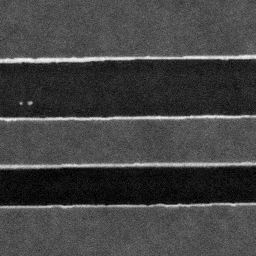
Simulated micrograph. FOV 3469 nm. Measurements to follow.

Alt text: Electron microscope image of lines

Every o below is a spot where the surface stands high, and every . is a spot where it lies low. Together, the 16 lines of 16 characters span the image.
oooooooooooooooo
oooooooooooooooo
oooooooooooooooo
oooooooooooooooo
................
................
................
oooooooooooooooo
oooooooooooooooo
oooooooooooooooo
................
................
................
oooooooooooooooo
oooooooooooooooo
oooooooooooooooo